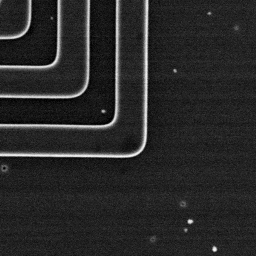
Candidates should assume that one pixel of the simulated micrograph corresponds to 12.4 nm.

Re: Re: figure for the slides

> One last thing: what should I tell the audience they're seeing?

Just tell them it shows groups of lines, slits or small figures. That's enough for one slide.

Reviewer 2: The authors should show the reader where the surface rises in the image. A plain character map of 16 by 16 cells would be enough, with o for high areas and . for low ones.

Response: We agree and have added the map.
oo..oo.oo.......
oo..oo.oo.......
....oo.oo.......
....oo.oo.......
oooooo.oo.......
ooooo..oo.......
.......oo.......
.......oo.......
ooooooooo.......
ooooooooo.......
................
................
................
................
................
................